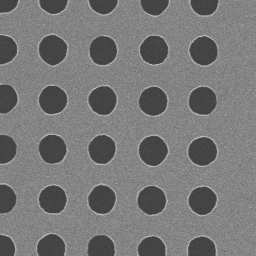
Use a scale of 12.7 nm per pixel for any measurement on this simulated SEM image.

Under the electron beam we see a regular array of holes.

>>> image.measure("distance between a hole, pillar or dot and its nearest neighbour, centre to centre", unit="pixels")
49.3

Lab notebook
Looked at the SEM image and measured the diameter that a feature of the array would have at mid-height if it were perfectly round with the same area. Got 359 nanometres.